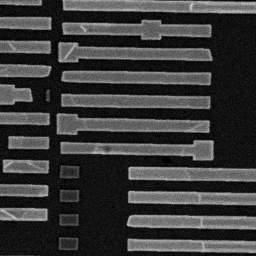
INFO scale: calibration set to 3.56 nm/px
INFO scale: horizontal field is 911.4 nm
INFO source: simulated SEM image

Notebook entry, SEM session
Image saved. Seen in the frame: wiring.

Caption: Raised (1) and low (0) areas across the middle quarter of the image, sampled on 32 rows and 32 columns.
00000000000000000000000000000000
00000000000000000000000000000000
11111111111111111111111111111111
11111111111111111111111111111111
00011111111111111111111111111111
00000000000000000000000000000000
00000000000000000000000000000000
00000000000000000000000000000000
11111111111111111111111111111111
11111111111111111111111111111111
00001111111111111111111111111111
00000000000000000000000000000000
00000000000000000000000000000000
11110000000000000000000000000000
11111111111111111111111111111111
11111111111111111111111111111111
11111111111111111111111111111111
01100000000000000000000000000000
00000000000000000000000000000000
00000000000000000000000000000000
11111111111111111111111111111111
11111111111111111111111111111111
00000000000000000111111111111111
00000000000000000000000000000000
00000000000000000000000000000000
00000000000000000000000000000000
11110000000000001111111111111111
11110000000000001111111111111111
00000000000000001111111111111111
00000000000000000000000000000000
00000000000000000000000000000000
00000000000000000000000000000000